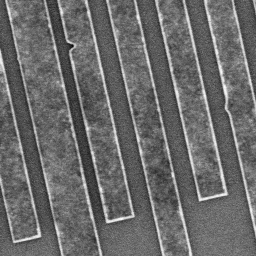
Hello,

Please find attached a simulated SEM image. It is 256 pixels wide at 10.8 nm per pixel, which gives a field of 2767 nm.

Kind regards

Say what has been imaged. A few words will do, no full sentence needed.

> parallel lines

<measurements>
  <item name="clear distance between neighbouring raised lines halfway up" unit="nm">215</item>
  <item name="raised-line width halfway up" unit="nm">297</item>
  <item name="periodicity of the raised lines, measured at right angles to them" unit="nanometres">510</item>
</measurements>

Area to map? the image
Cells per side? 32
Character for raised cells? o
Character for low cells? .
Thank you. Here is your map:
.ooooo.oooo...ooo...ooo...ooo...
.ooooo..ooo...ooo...ooo...ooo...
.ooooo..ooo...ooo...oooo..oooo..
..oooo..ooo...oooo..oooo..oooo..
..ooooo.oooo..oooo..oooo...ooo..
..ooooo..ooo...ooo...ooo...ooo..
..ooooo..ooo...ooo...ooo...ooo..
..ooooo..ooo...ooo...oooo..oooo.
...oooo..oooo..oooo..oooo..oooo.
o..ooooo.oooo..oooo...ooo...ooo.
o..ooooo..ooo...ooo...ooo...ooo.
o..ooooo..ooo...ooo...oooo..oooo
o...oooo..ooo...oooo..oooo..oooo
oo..ooooo.oooo..oooo..oooo..oooo
oo..ooooo..ooo...ooo...ooo...ooo
oo..ooooo..ooo...ooo...ooo...ooo
oo..ooooo..ooo...ooo...oooo..ooo
oo...oooo..oooo..oooo..oooo..ooo
ooo..ooooo.oooo..oooo...ooo...oo
ooo..ooooo..ooo...ooo...ooo...oo
ooo..ooooo..ooo...ooo...ooo...oo
ooo...oooo..ooo...oooo..oooo..oo
oooo..ooooo.oooo..oooo..oooo...o
oooo..ooooo..ooo...ooo...ooo...o
oooo..ooooo..ooo...ooo...oo....o
.ooo..ooooo..ooo...ooo.........o
.ooo...oooo..oooo..oooo........o
.oooo..ooooo.......oooo.........
.oooo..ooooo........ooo.........
..ooo..ooooo........ooo.........
.......ooooo........oooo........
........ooooo.......oooo........